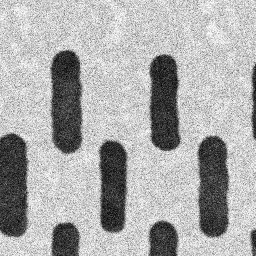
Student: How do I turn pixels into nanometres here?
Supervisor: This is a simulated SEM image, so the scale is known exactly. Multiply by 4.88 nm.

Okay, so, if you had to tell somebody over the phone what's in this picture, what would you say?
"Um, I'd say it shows holes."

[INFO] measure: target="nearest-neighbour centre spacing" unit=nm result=470